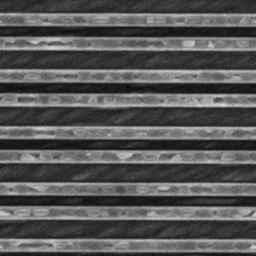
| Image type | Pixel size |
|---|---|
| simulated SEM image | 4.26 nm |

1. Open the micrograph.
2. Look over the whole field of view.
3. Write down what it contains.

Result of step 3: parallel lines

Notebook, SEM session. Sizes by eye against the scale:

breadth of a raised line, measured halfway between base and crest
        51.1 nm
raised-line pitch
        120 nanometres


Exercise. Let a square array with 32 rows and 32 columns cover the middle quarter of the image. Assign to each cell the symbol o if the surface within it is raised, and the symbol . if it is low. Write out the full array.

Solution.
................................
................................
oooooooooooooooooooooooooooooooo
oooooooooooooooooooooooooooooooo
..........................oooooo
................................
................................
......o.........................
oooooooooooooooooooooooooooooooo
oooooooooooooooooooooooooooooooo
...............ooooooooooooooooo
................................
................................
................................
................................
................................
oooooooooooooooooooooooooooooooo
oooooooooooooooooooooooooooooooo
oooooooooooooooooooooooooooooooo
................................
................................
................................
oooooooooooooooooooooooooooooooo
oooooooooooooooooooooooooooooooo
oooooooooooooooooooooooooooooooo
................................
................................
................................
................................
................................
oooooooooooooooooooooooooooooooo
oooooooooooooooooooooooooooooooo